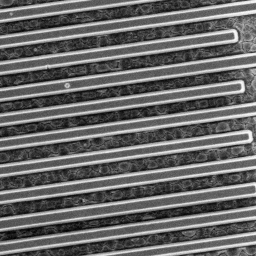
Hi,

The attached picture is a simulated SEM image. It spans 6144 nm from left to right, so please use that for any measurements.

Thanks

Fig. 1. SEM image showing parallel lines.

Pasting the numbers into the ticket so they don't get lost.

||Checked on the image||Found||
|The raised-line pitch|0.613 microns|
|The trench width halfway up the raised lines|0.35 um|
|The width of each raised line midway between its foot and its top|267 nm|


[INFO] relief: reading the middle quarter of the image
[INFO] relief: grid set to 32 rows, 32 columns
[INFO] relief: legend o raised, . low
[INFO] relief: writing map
..........................oooooo
..................oooooooooooooo
............oooooooooooooooooooo
....oooooooooooooooooooooo......
oooooooooooooooooo..............
oooooooooo......................
oooo........................oooo
.....................ooooooooooo
..............oooooooooooooooooo
.......ooooooooooooooooooo......
ooooooooooooooooooo.............
oooooooooooo....................
oooo.........................ooo
......................oooooooooo
..............oooooooooooooooooo
.......ooooooooooooooooooo......
ooooooooooooooooooo.............
oooooooooooo....................
ooooo...........................
...........................ooooo
...................ooooooooooooo
............ooooooooooooooooooo.
.....ooooooooooooooooooo........
ooooooooooooooooo...............
oooooooooo......................
ooo.............................
........................oooooooo
.................ooooooooooooooo
..........ooooooooooooooooooo...
...ooooooooooooooooooo..........
ooooooooooooooo.................
ooooooooo.......................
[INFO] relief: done